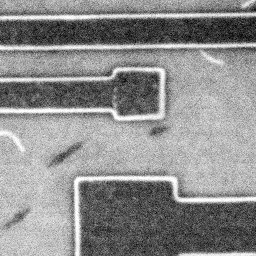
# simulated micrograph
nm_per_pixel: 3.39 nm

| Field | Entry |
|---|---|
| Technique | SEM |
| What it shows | groups of lines, slits or small figures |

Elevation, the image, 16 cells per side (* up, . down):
................
****************
****************
................
.......***......
**********......
**********......
................
................
................
................
.....******.....
.....*******.***
.....***********
.....***********
.....***********